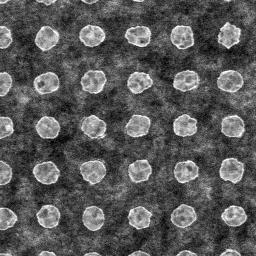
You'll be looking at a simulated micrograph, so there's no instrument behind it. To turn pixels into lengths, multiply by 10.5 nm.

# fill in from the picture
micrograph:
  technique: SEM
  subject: a regular array of raised bodies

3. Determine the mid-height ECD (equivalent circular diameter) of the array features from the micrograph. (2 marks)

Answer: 236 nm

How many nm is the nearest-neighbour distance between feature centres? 468